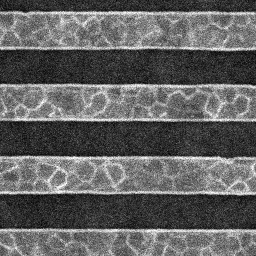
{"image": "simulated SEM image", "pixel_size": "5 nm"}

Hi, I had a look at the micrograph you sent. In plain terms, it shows one or a few lines or trenches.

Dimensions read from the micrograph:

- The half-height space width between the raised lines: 37 pixels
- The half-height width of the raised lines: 0.177 micrometres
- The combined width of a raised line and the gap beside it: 361 nm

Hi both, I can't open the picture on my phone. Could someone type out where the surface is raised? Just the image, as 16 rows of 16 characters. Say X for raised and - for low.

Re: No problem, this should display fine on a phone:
----------------
XXXXXXXXXXXXXXXX
XXXXXXXXXXXXXXXX
----------------
----------------
XXXXXXXXXXXXXXXX
XXXXXXXXXXXXXXXX
---------XXXXXXX
----------------
----------------
XXXXXXXXXXXXXXXX
XXXXXXXXXXXXXXXX
----------------
----------------
XXXXXXXXXXXXXXXX
XXXXXXXXXXXXXXXX